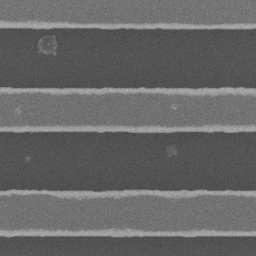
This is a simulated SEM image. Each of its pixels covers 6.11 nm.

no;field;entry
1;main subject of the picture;lines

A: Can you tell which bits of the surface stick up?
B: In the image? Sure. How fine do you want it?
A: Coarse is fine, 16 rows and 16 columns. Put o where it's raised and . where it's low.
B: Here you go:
oooooooooooooooo
oooooooooooooooo
................
................
................
................
oooooooooooooooo
oooooooooooooooo
................
................
................
................
oooooooooooooooo
oooooooooooooooo
oooooooooooooooo
................